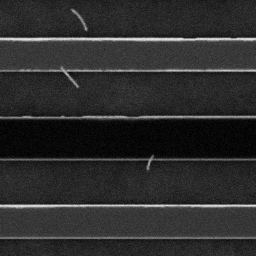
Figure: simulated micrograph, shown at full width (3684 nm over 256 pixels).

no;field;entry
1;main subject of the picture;lines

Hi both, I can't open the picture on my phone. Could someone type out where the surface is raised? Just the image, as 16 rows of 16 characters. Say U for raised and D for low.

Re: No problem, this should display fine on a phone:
DDDDDDDDDDDDDDDD
DDDDDDDDDDDDDDDD
UUUUUUUUUUUUUUUU
UUUUUUUUUUUUUUUU
DDDDDDDDDDDDDDDD
DDDDDDDDDDDDDDDD
DDDDDDDDDDDDDDDD
UUUUUUUUUUUUUUUU
UUUUUUUUUUUUUUUU
UUUUUUUUUUUUUUUU
DDDDDDDDDDDDDDDD
DDDDDDDDDDDDDDDD
DDDDDDDDDDDDDDDD
UUUUUUUUUUUUUUUU
UUUUUUUUUUUUUUUU
DDDDDDDDDDDDDDDD